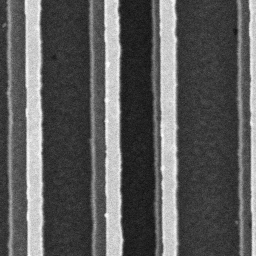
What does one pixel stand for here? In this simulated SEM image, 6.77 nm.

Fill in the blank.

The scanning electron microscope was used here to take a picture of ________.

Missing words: lines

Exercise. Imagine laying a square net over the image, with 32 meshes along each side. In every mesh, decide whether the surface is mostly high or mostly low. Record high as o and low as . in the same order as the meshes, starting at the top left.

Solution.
.oooo......oooo....ooo........oo
.oooo......oooo....ooo........oo
.oooo......oooo....ooo........oo
.oooo......oooo....ooo........oo
.oooo......oooo....ooo........oo
.oooo......oooo....ooo........oo
.oooo......oooo....ooo........oo
.oooo.......ooo....ooo........oo
.oooo.......ooo....ooo........oo
.oooo......oooo....ooo........oo
.oooo......oooo....ooo........oo
.oooo......oooo....ooo........oo
.oooo.......ooo....ooo........oo
.oooo.......ooo....ooo........oo
.oooo.......ooo....ooo........oo
.oooo.......ooo....ooo........oo
.oooo.......ooo....ooo........oo
.oooo.......ooo....ooo........oo
.oooo.......ooo....ooo........oo
.oooo.......ooo....ooo........oo
.oooo.......ooo....ooo........oo
.oooo.......ooo....ooo........oo
.oooo.......ooo.....oo........oo
.oooo.......ooo.....oo........oo
.oooo.......ooo.....oo........oo
.oooo.......ooo....ooo........oo
.oooo.......ooo....ooo........oo
.oooo.......ooo.....oo........oo
.oooo.......ooo.....oo........oo
.oooo.......ooo.....oo........oo
.oooo.......ooo.....oo........oo
.oooo.......ooo.....oo........oo